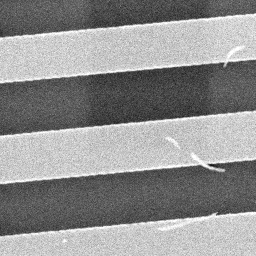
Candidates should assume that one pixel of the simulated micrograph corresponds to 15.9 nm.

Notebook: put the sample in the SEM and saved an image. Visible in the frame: lines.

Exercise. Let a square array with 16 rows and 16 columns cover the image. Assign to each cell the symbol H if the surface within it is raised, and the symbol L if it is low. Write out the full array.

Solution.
LLLLLLLLLLLLLLLL
LLLLLLLLLHHHHHHH
HHHHHHHHHHHHHHHH
HHHHHHHHHHHHHHHH
HHHHHHHLLLLLLLLL
LLLLLLLLLLLLLLLL
LLLLLLLLLLLLLLLL
LLLLLLLLLLHHHHHH
HHHHHHHHHHHHHHHH
HHHHHHHHHHHHHHHH
HHHHHHHHHHLLLLLL
LLLLLLLLLLLLLLLL
LLLLLLLLLLLLLLLL
LLLLLLLLLLLLLHHH
LLLHHHHHHHHHHHHH
HHHHHHHHHHHHHHHH